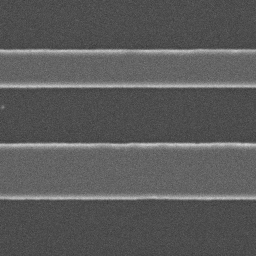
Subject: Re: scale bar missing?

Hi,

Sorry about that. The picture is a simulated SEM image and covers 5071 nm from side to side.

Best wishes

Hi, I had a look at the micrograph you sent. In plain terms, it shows lines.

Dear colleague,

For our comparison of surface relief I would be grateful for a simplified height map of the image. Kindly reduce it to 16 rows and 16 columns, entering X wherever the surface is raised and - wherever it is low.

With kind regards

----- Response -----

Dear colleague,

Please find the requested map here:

----------------
----------------
----------------
XXXXXXXXXXXXXXXX
XXXXXXXXXXXXXXXX
----------------
----------------
----------------
----------------
XXXXXXXXXXXXXXXX
XXXXXXXXXXXXXXXX
XXXXXXXXXXXXXXXX
----------------
----------------
----------------
----------------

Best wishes